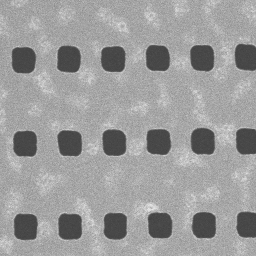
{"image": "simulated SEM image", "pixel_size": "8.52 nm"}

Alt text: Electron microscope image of a regular array of holes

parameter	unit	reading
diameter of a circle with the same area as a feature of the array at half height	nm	226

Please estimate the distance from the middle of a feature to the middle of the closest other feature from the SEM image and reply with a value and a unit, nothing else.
378 nm